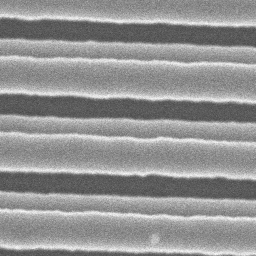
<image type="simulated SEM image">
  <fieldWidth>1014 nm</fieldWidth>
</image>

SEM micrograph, lines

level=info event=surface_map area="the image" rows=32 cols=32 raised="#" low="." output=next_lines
################################
################################
...........#####################
................................
................................
################................
################################
################################
################################
################################
################################
################################
........................########
................................
................................
################################
################################
################################
################################
################################
################################
.........#.#####################
................................
................................
##########......................
################################
################################
################################
################################
################################
################################
.....................###########